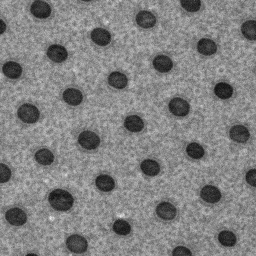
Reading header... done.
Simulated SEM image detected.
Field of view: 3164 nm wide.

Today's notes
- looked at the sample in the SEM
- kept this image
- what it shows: a regular array of holes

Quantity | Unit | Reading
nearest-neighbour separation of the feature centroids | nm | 572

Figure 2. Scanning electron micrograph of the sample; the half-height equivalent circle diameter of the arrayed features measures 250 nm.